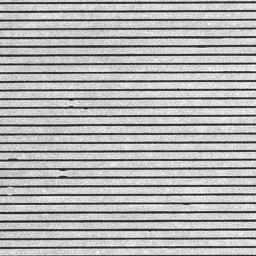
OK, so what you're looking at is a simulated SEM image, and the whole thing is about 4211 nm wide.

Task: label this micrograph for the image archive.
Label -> parallel lines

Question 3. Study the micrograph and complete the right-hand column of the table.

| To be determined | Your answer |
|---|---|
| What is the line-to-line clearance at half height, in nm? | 43.2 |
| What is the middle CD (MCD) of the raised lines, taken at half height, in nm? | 101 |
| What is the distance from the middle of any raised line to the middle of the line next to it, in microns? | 0.144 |